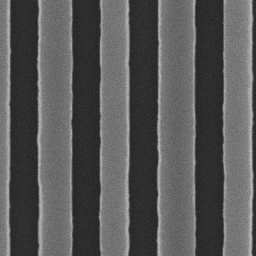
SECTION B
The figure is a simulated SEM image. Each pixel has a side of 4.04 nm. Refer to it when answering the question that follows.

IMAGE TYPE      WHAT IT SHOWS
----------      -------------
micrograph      lines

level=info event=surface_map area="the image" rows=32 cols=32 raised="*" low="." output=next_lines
*....****....***....****....***.
*....****....***....****....***.
*....****....***....****....****
*....****....***....****....***.
*....****....***....****....***.
*....****....***....****....***.
*....****....***....****....***.
*....****....***....****....***.
*....****....***....****....***.
*....****....***....****....****
*....****....***....****....***.
*....****....***....****....***.
*....****....***....****....***.
*....****....***....****....***.
*....****....***....****....****
*....****....***....****....****
*....****....***....****....***.
*....****....***....****....***.
*....****....***....****....***.
*....****....***....****....***.
*....****....***....****....***.
*....****....***....****....****
*....****....***....****....****
*....****....***....****....****
*....****....***....****....****
*....****....***....****....***.
*....****...****....****....***.
*....****...****....****....***.
*....****....***....****....***.
*....****....***....****....***.
*....****....***....****....***.
*....****....***....****....***.